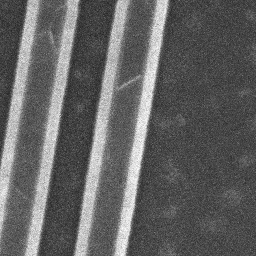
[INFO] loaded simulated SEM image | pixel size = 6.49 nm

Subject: one or a few lines or trenches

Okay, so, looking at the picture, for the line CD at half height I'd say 40.4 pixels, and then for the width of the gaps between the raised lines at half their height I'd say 306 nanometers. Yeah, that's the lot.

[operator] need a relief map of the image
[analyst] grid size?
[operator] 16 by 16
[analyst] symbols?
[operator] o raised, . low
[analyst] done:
..ooo...oo......
..oo...ooo......
..oo...ooo......
..oo...ooo......
.ooo...oo.......
.ooo...oo.......
.ooo...oo.......
.oo...ooo.......
.oo...ooo.......
.oo...ooo.......
ooo...oo........
ooo...oo........
ooo...oo........
oo...ooo........
oo...ooo........
oo...ooo........